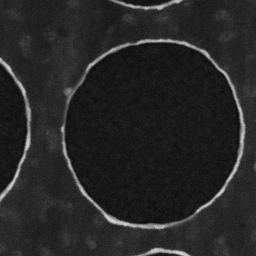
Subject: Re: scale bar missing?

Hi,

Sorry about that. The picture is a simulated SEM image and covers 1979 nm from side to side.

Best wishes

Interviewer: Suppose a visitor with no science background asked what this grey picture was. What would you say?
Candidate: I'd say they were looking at holes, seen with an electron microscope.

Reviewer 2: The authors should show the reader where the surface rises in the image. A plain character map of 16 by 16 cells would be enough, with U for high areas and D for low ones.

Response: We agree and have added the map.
UUUUUUUUUUUUUUUU
UUUUUUUUUUUUUUUU
UUUUUUUUUUUUUUUU
UUUUUUUDDDDDDUUU
DUUUUUDDDDDDDDUU
DUUUUDDDDDDDDDUU
DDUUDDDDDDDDDDDU
DDUUDDDDDDDDDDDU
DDUUDDDDDDDDDDDU
DUUUDDDDDDDDDDDU
DUUUUDDDDDDDDDDU
DUUUUDDDDDDDDDUU
UUUUUUDDDDDDDUUU
UUUUUUUDDDDDUUUU
UUUUUUUUUUUUUUUU
UUUUUUUUUUUUUUUU